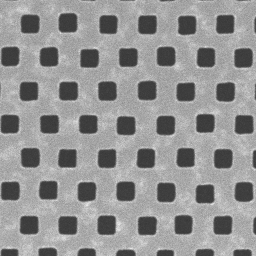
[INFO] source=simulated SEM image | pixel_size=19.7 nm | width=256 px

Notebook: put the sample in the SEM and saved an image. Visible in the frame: a regular array of holes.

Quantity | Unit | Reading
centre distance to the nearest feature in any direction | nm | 739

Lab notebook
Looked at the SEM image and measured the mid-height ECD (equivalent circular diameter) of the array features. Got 414 nanometres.